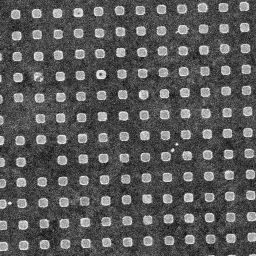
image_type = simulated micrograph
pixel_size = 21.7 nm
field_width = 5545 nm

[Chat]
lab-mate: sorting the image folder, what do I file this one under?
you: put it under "a regular array of raised bodies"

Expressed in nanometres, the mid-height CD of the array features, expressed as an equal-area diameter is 194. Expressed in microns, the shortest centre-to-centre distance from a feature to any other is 0.443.